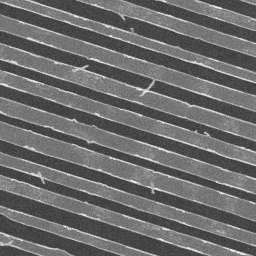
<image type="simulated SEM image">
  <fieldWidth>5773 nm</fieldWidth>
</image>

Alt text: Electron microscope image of parallel lines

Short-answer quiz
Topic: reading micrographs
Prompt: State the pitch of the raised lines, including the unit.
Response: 576 nanometers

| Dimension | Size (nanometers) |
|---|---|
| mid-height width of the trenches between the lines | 274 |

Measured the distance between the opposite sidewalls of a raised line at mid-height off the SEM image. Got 0.317 µm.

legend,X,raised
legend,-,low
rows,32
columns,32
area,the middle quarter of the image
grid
XX----------XXXXXXXXXXXX--------
XXXXX----------XXXXXXXXXXXX-----
XXXXXXXX----------XXXXXXXXXXXXX-
XXXXXXXXXXX----------XXXXXXXXXXX
-XXXXXXXXXXXXX-----------XXXXXXX
-----XXXXXXXXXXXX-----------XXXX
--------XXXXXXXXXXXXX----------X
XXX--------XXXXXXXXXXXXX--------
XXXXXX--------XXXXXXXXXXXXX-----
XXXXXXXXX--------XXXXXXXXXXXXX--
XXXXXXXXXXXX--------XXXXXXXXXXXX
----XXXXXXXXXXXX-------XXXXXXXXX
-------XXXXXXXXXXXX--------XXXXX
----------XXXXXXXXXXXX--------XX
XXXX---------XXXXXXXXXXXX-------
XXXXXXX---------XXXXXXXXXXXX----
XXXXXXXXXX---------XXXXXXXXXXXX-
-XXXXXXXXXXXX---------XXXXXXXXXX
----XXXXXXXXXXXX----------XXXXXX
------XXXXXXXXXXXXX----------XXX
XXX-------XXXXXXXXXXXX----------
XXXXXX-------XXXXXXXXXXXXX------
XXXXXXXXX-------XXXXXXXXXXXXX---
XXXXXXXXXXXXX-------XXXXXXXXXXXX
--XXXXXXXXXXXXXX-------XXXXXXXXX
-----XXXXXXXXXXXXXX-------XXXXXX
-------XXXXXXXXXXXXXXX-------XXX
X----------XXXXXXXXXXXXXX-------
XXXX----------XXXXXXXXXXXXXX----
XXXXXXXX---------XXXXXXXXXXXXXX-
-XXXXXXXXXX---------XXXXXXXXXXXX
---XXXXXXXXXXX--------XXXXXXXXXX